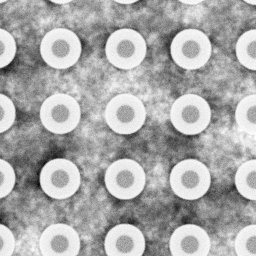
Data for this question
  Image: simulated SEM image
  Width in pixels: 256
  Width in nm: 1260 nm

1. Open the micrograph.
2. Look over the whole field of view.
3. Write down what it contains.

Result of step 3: an array of small figures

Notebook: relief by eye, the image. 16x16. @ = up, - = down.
----------------
----------------
@--@@--@@--@@--@
@--@@--@@--@@--@
----------------
----------------
@--@@--@@--@@--@
@--@@--@@--@@--@
----------------
----------------
@--@@--@@--@@--@
@--@@--@@--@@--@
----------------
----------------
@--@@--@@--@@--@
@--@@--@@--@@--@